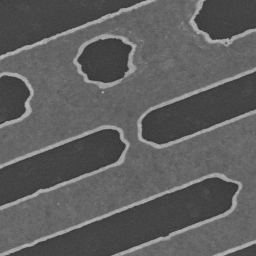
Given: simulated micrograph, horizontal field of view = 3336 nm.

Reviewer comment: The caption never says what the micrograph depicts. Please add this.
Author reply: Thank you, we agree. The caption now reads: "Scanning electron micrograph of one or a few lines or trenches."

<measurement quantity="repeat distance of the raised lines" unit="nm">1030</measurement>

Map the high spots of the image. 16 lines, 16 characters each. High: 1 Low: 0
0000000011110000
0000001111110000
0001110011111011
1111100011111111
1111100011111111
0011111111111000
0011111111000000
0111111110000011
1111100010001111
1100000011111111
0000000111111111
0000111111110001
0111111110000001
1111111000000011
1111000000011111
1000000011111110